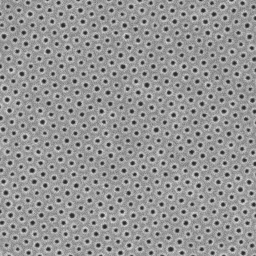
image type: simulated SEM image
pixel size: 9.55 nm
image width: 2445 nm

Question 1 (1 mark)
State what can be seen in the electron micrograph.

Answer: a regular array of holes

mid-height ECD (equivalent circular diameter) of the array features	43.1	nm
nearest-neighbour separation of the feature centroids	0.107	µm